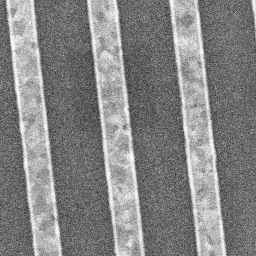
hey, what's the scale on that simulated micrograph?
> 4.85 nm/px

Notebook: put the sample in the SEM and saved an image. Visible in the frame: one or a few lines or trenches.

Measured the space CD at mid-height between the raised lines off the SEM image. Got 277 nm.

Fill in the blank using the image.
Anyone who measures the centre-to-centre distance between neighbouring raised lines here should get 0.395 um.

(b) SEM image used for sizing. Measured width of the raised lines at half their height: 0.118 microns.